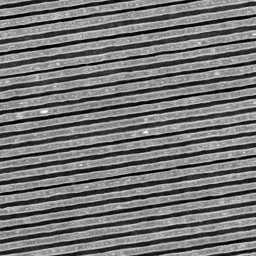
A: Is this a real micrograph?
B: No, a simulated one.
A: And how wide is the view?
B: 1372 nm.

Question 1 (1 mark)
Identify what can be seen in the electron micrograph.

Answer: parallel lines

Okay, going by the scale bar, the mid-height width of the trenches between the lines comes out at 21.2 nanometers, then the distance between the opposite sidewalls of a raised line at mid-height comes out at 41.7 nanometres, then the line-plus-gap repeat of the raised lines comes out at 62.3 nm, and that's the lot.